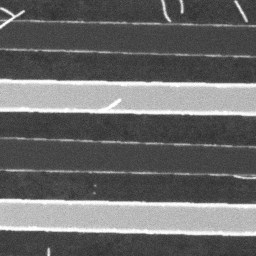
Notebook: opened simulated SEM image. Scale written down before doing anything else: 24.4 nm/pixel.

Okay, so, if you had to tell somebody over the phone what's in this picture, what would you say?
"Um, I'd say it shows lines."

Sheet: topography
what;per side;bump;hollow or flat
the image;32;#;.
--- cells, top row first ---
................................
................................
................................
################################
################################
################################
............####################
................................
................................
................................
###########################.....
################################
################################
################################
................................
................................
................................
######..........................
################################
################################
################################
............####################
................................
................................
................................
#########################.......
################################
################################
################################
................................
................................
................................